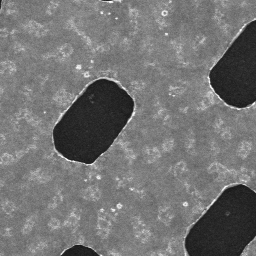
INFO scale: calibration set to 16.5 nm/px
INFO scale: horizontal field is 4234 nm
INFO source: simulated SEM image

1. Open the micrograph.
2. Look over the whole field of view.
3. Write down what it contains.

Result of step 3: holes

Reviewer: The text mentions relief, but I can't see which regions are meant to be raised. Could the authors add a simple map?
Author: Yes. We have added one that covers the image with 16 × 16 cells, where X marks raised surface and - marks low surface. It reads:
XXXXXXXXXXXXXXXX
XXXXXXXXXXXXXXXX
XXXXXXXXXXXXXXX-
XXXXXXXXXXXXXX--
XXXXXXXXXXXXX---
XXXXX---XXXXX---
XXXXX---XXXXXX--
XXXX----XXXXXXXX
XXX----XXXXXXXXX
XXXX---XXXXXXXXX
XXXXXXXXXXXXXXXX
XXXXXXXXXXXXXXXX
XXXXXXXXXXXXXX--
XXXXXXXXXXXXX---
XXXXXXXXXXXX----
XXXX--XXXXXX---X